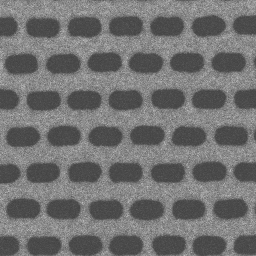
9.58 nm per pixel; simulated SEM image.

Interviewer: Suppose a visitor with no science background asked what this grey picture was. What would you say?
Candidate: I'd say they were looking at a regular array of holes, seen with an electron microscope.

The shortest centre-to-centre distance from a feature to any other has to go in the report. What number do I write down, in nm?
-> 394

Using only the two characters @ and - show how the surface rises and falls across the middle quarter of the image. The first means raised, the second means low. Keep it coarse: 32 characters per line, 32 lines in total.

----@@--------@@---------@@-----
----@@@-------@@@-------@@@-----
--@@@@@@@@@@@@@@@@@@@@@@@@@@@@@@
@@@@@@@@@@@@@@@@@@@@@@@@@@@@@@@@
@@@@@@@@@@@@@@@@@@@@@@@@@@@@@@@@
@@@@@@@@@@@@@@@@@@@@@@@@@@@@@@@@
@@@@@@@@@@@@@@@@@-@@@@@------@@@
@--------@@@-------@@@--------@@
@--------@@---------@@---------@
@--------@@---------@@--------@@
@--------@@--------@@@--------@@
@@------@@@@@---@@@@@@@@@@@@@@@@
@@@@@@@@@@@@@@@@@@@@@@@@@@@@@@@@
@@@@@@@@@@@@@@@@@@@@@@@@@@@@@@@@
@@@@@@@@@@@@@@@@@@@@@@@@@@@@@@@@
--@@@@@@@@@@@@@@@@@-----@@@@@--@
----@@@-------@@@--------@@@----
----@@---------@@--------@@-----
----@@---------@@--------@@-----
----@@--------@@@-------@@@-----
--@@@@@@-----@@@@@@@@@@@@@@@@---
@@@@@@@@@@@@@@@@@@@@@@@@@@@@@@@@
@@@@@@@@@@@@@@@@@@@@@@@@@@@@@@@@
@@@@@@@@@@@@@@@@@@@@@@@@@@@@@@@@
@@@@@--@@@@@@@@@@@@@@@@@@@@@@@@@
@@-------@@@-------@@@--------@@
@---------@---------@@--------@@
@--------@@---------@@--------@@
@--------@@--------@@@--------@@
@@------@@@@------@@@@@------@@@
@@@@@@@@@@@@@@@@@@@@@@@@@@@@@@@@
@@@@@@@@@@@@@@@@@@@@@@@@@@@@@@@@